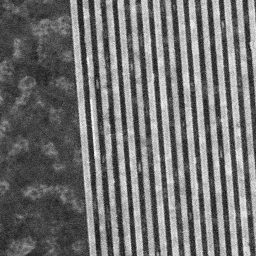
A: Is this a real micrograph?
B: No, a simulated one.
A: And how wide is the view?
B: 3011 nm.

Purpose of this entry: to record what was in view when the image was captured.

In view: parallel lines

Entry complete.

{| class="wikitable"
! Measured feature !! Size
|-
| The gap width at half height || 73.3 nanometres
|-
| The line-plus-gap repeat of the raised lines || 139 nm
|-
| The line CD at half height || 5.36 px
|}